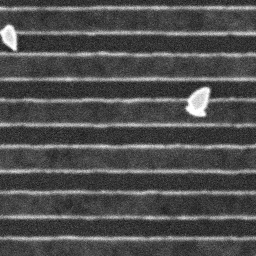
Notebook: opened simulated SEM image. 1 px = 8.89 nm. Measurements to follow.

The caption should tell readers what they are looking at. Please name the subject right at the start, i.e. lines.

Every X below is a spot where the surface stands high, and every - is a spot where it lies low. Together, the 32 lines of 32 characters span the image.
--------------------------------
XXXXXXXXXXXXXXXXXXXXXXXXXXXXXXXX
XXXXXXXXXXXXXXXXXXXXXXXXXXXXXXXX
XXXXXXXXXXXXXXXXXXXXXXXXXXXXXXXX
XX------------------------------
-X------------------------------
--------------------------------
XXXXXXXXXXXXXXXXXXXXXXXXXXXXXXXX
XXXXXXXXXXXXXXXXXXXXXXXXXXXXXXXX
XXXXXXXXXXXXXXXXXXXXXXXXXXXXXXXX
--------------------------------
-------------------------X------
X--XX-----XXX---XXXXXXXXXXXXXXXX
XXXXXXXXXXXXXXXXXXXXXXXXXXXXXXXX
XXXXXXXXXXXXXXXXXXXXXXXXXXXXXXXX
XXXXXXXXXXXXXXXXXXXXXXXXXXXXXXXX
--------------------------------
--------------------------------
XXXXXXXXXXXXXXXXXXXXXXXXXXXXXXXX
XXXXXXXXXXXXXXXXXXXXXXXXXXXXXXXX
XXXXXXXXXXXXXXXXXXXXXXXXXXXXXXXX
----------------------------XX--
--------------------------------
--------------------------------
XXXXXXXXXXXXXXXXXXXXXXXXXXXXXXXX
XXXXXXXXXXXXXXXXXXXXXXXXXXXXXXXX
XXXXXXXXXXXXXXXXXXXXXXXXXXXXXXXX
--------------------------------
--------------------------------
--------------------------------
XXXXXXXXXXXXXXXXXXXXXXXXXXXXXXXX
XXXXXXXXXXXXXXXXXXXXXXXXXXXXXXXX